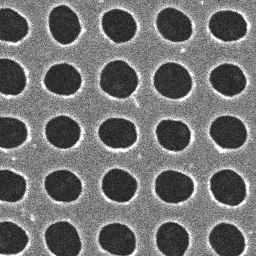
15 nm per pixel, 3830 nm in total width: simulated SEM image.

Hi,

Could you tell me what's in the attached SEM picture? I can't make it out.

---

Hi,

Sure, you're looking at a regular array of holes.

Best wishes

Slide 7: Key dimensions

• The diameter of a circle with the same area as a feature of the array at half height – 526 nm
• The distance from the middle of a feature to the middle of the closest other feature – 792 nm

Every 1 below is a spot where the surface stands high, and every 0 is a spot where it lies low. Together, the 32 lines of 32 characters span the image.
11111111111111111111111111111111
00111100011110001111000111100011
00011100001110000111000011000001
00001100001110000111000011000001
00011110001110000111000011100001
11111111011111111111111111111111
11111111111111111111111111111111
00111111111111111111111111111111
00011100011110000111000111100011
00011100001110000110000011000001
00011000001110000110000011000001
00011100011110000111000011100011
11111111111111111111111111111111
11111111111111111111111111111111
11111110111111111111111111110111
00011100001110000111000111000011
00011100001100000110000011000001
00011100001110000111000011100001
00111110011111001111000111110011
11111111111111111111111111111111
11111111111111111111111111111111
00111110011110001111001111100111
00011100001110000110000011000011
00011100001110000110000011000001
00011100001110000111000011100001
11111111111111111111111111110011
11111111111111111111111111111111
11111111111111111111111111111111
00011100011110001111000111100011
00011100001100000111000011000011
00011100001100000111000011000001
00011100001111000111000111100011